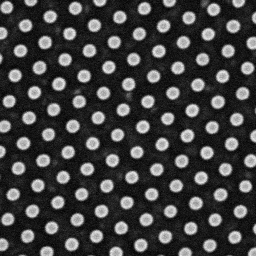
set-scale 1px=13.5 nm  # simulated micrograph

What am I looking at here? a regular array of raised bodies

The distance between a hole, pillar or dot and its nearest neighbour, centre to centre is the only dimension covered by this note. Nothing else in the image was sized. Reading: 344 nm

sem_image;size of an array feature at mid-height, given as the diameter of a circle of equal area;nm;156